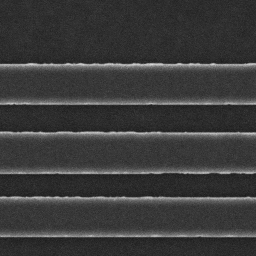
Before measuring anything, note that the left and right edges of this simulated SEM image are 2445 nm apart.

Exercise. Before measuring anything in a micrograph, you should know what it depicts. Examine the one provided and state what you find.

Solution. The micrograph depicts lines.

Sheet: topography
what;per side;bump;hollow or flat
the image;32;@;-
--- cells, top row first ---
--------------------------------
--------------------------------
--------------------------------
--------------------------------
--------------------------------
--------------------------------
--------------------------------
--------------------------------
@@@@@@@@@@@@@@@@@@@@@@@@@@@@@@@@
@@@@@@@@@@@@@@@@@@@@@@@@@@@@@@@@
@@@@@@@@@@@@@@@@@@@@@@@@@@@@@@@@
@@@@@@@@@@@@@@@@@@@@@@@@@@@@@@@@
@@@@@@@@@@@@@@@@@@@@@@@@@@@@@@@@
--------------------------------
--------------------------------
--------------------------------
--------------------------------
@@@@@@@@@@@@@@@@@@@@@@@@@@@@@@@@
@@@@@@@@@@@@@@@@@@@@@@@@@@@@@@@@
@@@@@@@@@@@@@@@@@@@@@@@@@@@@@@@@
@@@@@@@@@@@@@@@@@@@@@@@@@@@@@@@@
@@@@@@@@@@@@@@@@@@@@@@@@@@@@@@@@
--------------------------------
--------------------------------
--------------------------------
@@@@@@@@@@@@@@@@@@@@@@@@@@@@@@@@
@@@@@@@@@@@@@@@@@@@@@@@@@@@@@@@@
@@@@@@@@@@@@@@@@@@@@@@@@@@@@@@@@
@@@@@@@@@@@@@@@@@@@@@@@@@@@@@@@@
@@@@@@@@@@@@@@@@@@@@@@@@@@@@@@@@
--------------------------------
--------------------------------